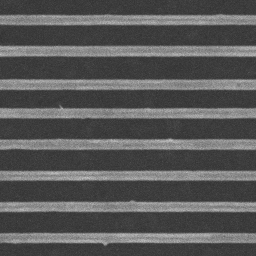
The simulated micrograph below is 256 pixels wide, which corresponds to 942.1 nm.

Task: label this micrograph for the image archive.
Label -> parallel lines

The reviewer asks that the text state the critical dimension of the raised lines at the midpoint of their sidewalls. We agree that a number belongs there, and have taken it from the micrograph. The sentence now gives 0.034 microns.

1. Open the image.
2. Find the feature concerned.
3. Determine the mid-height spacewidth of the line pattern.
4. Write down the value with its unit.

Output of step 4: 0.0814 micrometres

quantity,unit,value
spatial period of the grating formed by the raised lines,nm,115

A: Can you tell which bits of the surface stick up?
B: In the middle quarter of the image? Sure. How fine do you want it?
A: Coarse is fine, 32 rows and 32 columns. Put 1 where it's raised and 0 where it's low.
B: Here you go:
00000000000000000000000000000000
00000000000000000000000000000000
00000000000000000000000000000000
00000000000000000000000000000000
11111111111111111111111111111111
11111111111111111111111111111111
00000000000000000000000000000000
00000000000000000000000000000000
00000000000000000000000000000000
00000000000000000000000000000000
00000000000000000000000000000000
11111111111111111111111111111111
11111111111111111111111111111111
00000000000000000000000000000000
00000000000000000000000000000000
00000000000000000000000000000000
00000000000000000000000000000000
00000000000000000000000000000000
00000000000000000000000000000000
11111111111111111111111111111111
11111111111111111111111111111111
00000000000000000000000000000000
00000000000000000000000000000000
00000000000000000000000000000000
00000000000000000000000000000000
00000000000000000000000000000000
00000000000000000000000000000000
11111111111111111111111111111111
11111111111111111111111111111111
00000000000000000000000000000000
00000000000000000000000000000000
00000000000000000000000000000000